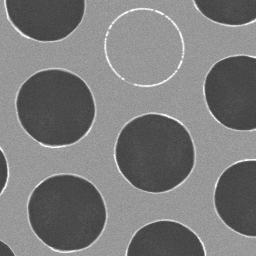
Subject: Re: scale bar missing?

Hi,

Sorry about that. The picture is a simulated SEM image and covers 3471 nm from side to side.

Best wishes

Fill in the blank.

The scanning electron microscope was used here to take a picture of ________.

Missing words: holes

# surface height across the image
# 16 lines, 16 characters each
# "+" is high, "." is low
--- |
.....+++++++....
+....+++++++++.+
++..++++++++++++
++++++++++++++++
++..+++++++++...
+.....+++++++...
+.....+++++++...
+.....++...+++..
++...++.....++++
+++++++.....++++
+++++++.....++..
+++...++...+++..
++....+++++++...
++.....+++++++..
++....+++...+++.
.++..+++.....+++